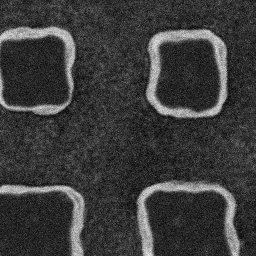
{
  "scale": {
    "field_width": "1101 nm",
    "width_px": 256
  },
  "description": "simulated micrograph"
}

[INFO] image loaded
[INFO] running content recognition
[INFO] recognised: raised bodies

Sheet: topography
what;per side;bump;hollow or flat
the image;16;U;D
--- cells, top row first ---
DDDDDDDDDDDDDDDD
DDDDDDDDDDDDDDDD
UUUUDDDDDDUUUDDD
UUUUUDDDDDUUUUDD
UUUUDDDDDDUUUUDD
UUUUDDDDDUUUUUDD
UUUUDDDDDDUUUUDD
DDDDDDDDDDDDDDDD
DDDDDDDDDDDDDDDD
DDDDDDDDDDDDDDDD
DDDDDDDDDDDDDDDD
DDDDDDDDDDDDDDDD
UUUUUDDDDUUUUUDD
UUUUUDDDDUUUUUDD
UUUUUDDDDUUUUUUD
UUUUUDDDDUUUUUUD